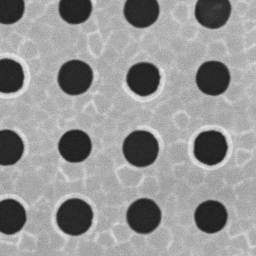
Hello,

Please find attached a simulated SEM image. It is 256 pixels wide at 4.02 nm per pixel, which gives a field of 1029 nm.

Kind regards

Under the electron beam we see a regular array of holes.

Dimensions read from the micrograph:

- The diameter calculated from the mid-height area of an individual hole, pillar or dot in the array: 138 nm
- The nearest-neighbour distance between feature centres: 0.275 µm